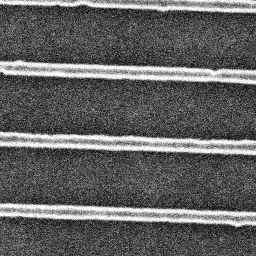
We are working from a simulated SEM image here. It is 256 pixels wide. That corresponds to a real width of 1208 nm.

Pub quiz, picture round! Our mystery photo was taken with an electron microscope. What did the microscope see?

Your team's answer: one or a few lines or trenches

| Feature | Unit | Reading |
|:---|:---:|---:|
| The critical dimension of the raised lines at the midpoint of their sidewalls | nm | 44.8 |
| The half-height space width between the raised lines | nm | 290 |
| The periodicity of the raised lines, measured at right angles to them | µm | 0.335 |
